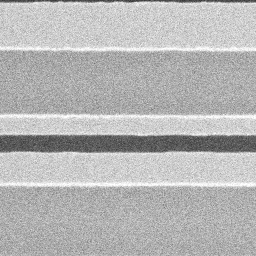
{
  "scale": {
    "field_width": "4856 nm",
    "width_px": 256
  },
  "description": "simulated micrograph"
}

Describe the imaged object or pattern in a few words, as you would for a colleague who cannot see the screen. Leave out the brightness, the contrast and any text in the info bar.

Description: lines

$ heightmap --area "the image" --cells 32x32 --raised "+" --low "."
++++++++++++++++++++++++++++++++
++++++++++++++++++++++++++++++++
++++++++++++++++++++++++++++++++
++++++++++++++++++++++++++++++++
++++++++++++++++++++++++++++++++
++++++++++++++++++++++++++++++++
................................
................................
................................
................................
................................
................................
................................
................................
................................
++++++++++++++++++++++++++++++++
++++++++++++++++++++++++++++++++
................................
................................
++++++++++++++++++++++++++++++++
++++++++++++++++++++++++++++++++
++++++++++++++++++++++++++++++++
++++++++++++++++++++++++++++++++
................................
................................
................................
................................
................................
................................
................................
................................
................................